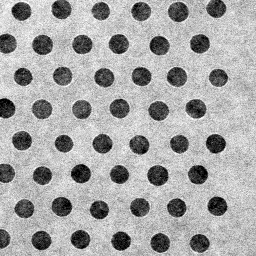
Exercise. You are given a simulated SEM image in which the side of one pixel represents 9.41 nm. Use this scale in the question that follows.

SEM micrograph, a regular array of raised bodies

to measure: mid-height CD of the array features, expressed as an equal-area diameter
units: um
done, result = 0.198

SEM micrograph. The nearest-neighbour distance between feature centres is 0.345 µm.